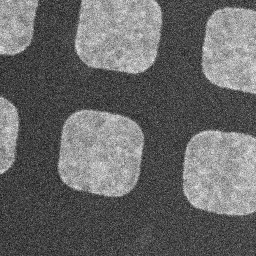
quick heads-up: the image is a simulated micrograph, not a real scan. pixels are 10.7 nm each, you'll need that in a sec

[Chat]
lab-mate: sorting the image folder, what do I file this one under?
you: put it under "raised bodies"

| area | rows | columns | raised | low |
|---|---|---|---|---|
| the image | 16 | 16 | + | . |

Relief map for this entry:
++...+++++......
++...+++++...+++
++...+++++...+++
.....+++++...+++
.............+++
...............+
+...............
+...++++........
+...+++++...+++.
+...+++++...++++
....+++++...++++
....++++....++++
............++++
................
................
................